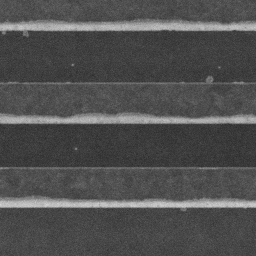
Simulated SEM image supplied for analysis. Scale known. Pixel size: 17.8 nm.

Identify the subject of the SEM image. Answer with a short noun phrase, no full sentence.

lines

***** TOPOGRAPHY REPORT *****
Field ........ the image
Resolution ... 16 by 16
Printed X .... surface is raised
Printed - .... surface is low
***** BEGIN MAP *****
XXXXXXXXXXXXXXXX
XXXXXXXXXXXXXXXX
----------------
----------------
----------------
XXXXXXXXXXXXXXXX
XXXXXXXXXXXXXXXX
XXXXXXXXXXXXXXXX
----------------
----------------
----------------
XXXXXXXXXXXXXXXX
XXXXXXXXXXXXXXXX
----------------
----------------
----------------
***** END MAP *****